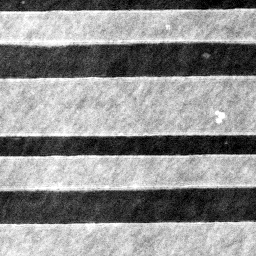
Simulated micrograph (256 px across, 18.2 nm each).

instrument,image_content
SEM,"lines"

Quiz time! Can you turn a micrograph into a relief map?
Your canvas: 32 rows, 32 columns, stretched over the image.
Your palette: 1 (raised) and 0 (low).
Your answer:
00000000000000000000000000000000
00000011111111111111111111111111
11111111111111111111111111111111
11111111111111111111111111111111
11111111111111111111111111111111
00000000000000000000000000000000
00000000000000000000000000000000
00000000000000000000000000000000
00000000000000000000000000000000
00000000000000000000000000000000
11111111111111111111111111111111
11111111111111111111111111111111
11111111111111111111111111111111
11111111111111111111111111111111
11111111111111111111111111111111
11111111111111111111111111111111
11111111111111111111111111111111
00000000000000000000000000000000
00000000000000000000000000000000
00000000000000000000000011111111
11111111111111111111111111111111
11111111111111111111111111111111
11111111111111111111111111111111
11111111100000000000000000000000
00000000000000000000000000000000
00000000000000000000000000000000
00000000000000000000000000000000
00000000000000000000000000000000
11111111111111111111111111111111
11111111111111111111111111111111
11111111111111111111111111111111
11111111111111111111111111111111